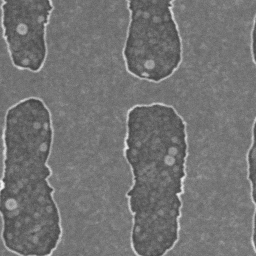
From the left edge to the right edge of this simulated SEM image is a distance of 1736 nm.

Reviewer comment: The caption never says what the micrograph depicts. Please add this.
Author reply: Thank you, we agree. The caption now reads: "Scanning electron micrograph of holes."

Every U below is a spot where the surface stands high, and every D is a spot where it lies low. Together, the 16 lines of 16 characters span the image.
DDDUUUUUDDDUUUUU
DDDUUUUUDDDUUUUU
DDDUUUUUDDDUUUUU
UDDUUUUUDDDUUUUU
UUUUUUUUDDDUUUUU
UUUUUUUUUUUUUUUU
UDDUUUUUUUUUUUUU
DDDUUUUUDDDUUUUU
DDDUUUUUDDDDUUUU
DDDUUUUUDDDDUUUU
DDDUUUUUDDDDUUUU
DDDUUUUUDDDUUUUU
DDDUUUUUDDDUUUUU
DDDDUUUUDDDUUUUU
DDDDUUUUDDDUUUUU
UDDUUUUUDDDUUUUU